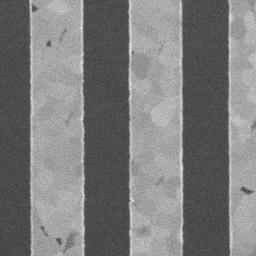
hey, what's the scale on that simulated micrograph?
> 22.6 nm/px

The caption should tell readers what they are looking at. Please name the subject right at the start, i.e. one or a few lines or trenches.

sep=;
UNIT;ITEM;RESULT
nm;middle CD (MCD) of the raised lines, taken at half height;1180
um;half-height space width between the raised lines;1.06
